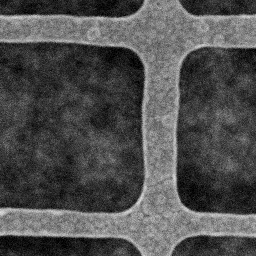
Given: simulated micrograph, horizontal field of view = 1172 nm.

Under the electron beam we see holes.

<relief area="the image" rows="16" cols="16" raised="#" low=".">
.........##.....
################
################
.........###....
.........##.....
.........##.....
.........##.....
.........##.....
.........##.....
.........##.....
.........##.....
.........##.....
.........##.....
################
################
.........##.....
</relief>